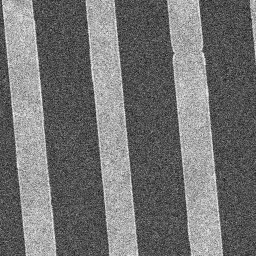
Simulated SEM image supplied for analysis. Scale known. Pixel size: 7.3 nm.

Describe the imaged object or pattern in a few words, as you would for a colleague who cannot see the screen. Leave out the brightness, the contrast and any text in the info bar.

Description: one or a few lines or trenches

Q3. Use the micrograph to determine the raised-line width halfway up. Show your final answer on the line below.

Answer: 218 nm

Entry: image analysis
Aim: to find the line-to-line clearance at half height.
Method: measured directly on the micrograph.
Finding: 389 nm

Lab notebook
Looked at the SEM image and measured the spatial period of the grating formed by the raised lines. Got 602 nanometers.